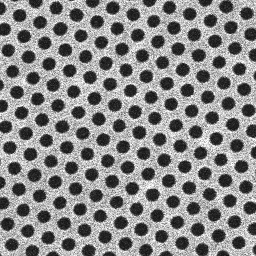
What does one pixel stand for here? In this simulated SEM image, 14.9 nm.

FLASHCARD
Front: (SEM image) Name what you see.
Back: a regular array of holes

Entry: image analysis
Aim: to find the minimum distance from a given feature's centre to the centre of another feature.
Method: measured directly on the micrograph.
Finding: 314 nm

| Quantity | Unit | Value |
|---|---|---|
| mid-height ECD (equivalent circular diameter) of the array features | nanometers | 210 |